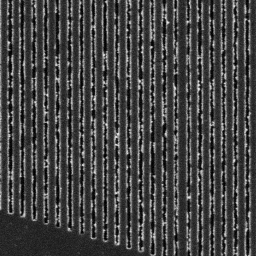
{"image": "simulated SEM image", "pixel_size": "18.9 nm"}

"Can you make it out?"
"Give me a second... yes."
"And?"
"parallel lines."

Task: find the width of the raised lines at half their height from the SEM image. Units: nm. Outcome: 170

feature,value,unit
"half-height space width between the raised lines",52.1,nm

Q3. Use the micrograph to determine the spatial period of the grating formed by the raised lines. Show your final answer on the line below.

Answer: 224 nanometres